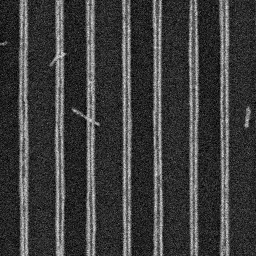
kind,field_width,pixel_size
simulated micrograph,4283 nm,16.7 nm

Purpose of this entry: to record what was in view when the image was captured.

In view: parallel lines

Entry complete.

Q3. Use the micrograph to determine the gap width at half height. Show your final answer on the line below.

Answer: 439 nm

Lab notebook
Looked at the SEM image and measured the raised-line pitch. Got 0.56 micrometres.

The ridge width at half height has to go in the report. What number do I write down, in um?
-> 0.0983